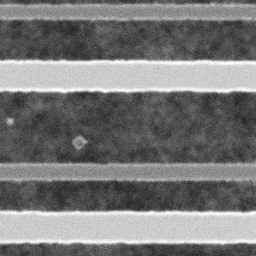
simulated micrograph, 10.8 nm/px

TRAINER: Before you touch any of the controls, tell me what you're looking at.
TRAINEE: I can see lines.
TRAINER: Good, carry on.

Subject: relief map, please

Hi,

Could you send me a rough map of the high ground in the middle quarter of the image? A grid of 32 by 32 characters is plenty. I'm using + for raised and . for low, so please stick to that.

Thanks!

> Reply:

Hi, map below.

++++++++++++++++++++++++++++++++
++++++++++++++++++++++++++++++++
++++++++++++++++++++++++++++++++
++++++++++++++++++++++++++++++++
++++++++++++++++++++++++++++++++
++++++++++++++++++++++++++++++++
++.......+++.++++++......++.....
................................
................................
................................
................................
................................
................................
................................
................................
................................
................................
................................
................................
...+............................
................................
................................
................................
................................
................................
++++++++++++++++++++++++++++++++
++++++++++++++++++++++++++++++++
++++++++++++++++++++++++++++++++
++++++++++++++++++++++++++++++++
................................
................................
................................